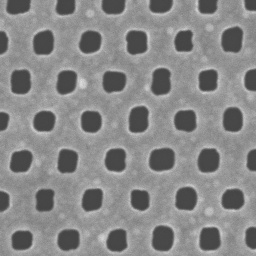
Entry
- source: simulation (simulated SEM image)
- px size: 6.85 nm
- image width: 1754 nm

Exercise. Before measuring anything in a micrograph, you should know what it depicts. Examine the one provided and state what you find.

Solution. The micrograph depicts a regular array of holes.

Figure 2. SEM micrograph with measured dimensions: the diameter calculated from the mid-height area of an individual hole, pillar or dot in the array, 0.161 um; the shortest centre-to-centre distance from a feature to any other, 311 nm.